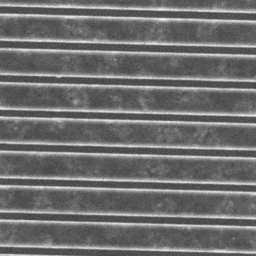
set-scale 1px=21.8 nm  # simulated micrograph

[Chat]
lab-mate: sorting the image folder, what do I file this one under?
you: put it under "parallel lines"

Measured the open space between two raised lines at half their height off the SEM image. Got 0.166 microns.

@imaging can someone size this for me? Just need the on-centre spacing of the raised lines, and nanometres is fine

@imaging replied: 748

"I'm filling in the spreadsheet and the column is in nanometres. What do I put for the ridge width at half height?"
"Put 571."